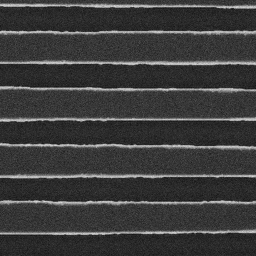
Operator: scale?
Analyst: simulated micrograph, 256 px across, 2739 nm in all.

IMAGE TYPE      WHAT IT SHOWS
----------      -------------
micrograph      lines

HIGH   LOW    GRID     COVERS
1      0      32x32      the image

11111111111111111111111111111111
00000000000000000000000000000000
00000000000000000000000000000000
00000000000000000000000000000000
11111111111111111111111111111111
11111111111111111111111111111111
11111111111111111111111111111111
11111111111111111111111111111111
00000000000000000000000000000000
00000000000000000000000000000000
00000000000000000000000000000000
11111111111111111111111111111111
11111111111111111111111111111111
11111111111111111111111111111111
11111111111111111111111111111111
00000000000000000000000000000000
00000000000000000000000000000000
00000000000000000000000000000000
11111111111111111111111111111111
11111111111111111111111111111111
11111111111111111111111111111111
11111111111111111111111111111111
00000000000000000000000000000000
00000000000000000000000000000000
00000000000000000000000000000000
11111111111111111111111111111111
11111111111111111111111111111111
11111111111111111111111111111111
11111111111111111111111111111111
00000000000000000000000000000000
00000000000000000000000000000000
00000000000000000000000000000000